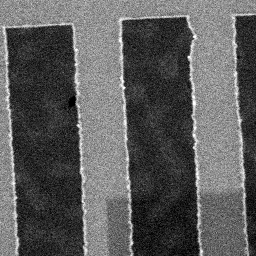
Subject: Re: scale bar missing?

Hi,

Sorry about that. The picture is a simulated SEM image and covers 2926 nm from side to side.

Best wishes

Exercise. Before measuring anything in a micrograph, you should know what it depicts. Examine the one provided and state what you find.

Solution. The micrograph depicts one or a few lines or trenches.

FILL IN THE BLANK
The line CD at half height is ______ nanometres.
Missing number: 789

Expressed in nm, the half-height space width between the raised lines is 519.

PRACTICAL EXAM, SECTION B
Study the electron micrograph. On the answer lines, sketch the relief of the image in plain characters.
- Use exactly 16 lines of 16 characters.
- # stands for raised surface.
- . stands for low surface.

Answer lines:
................
........####...#
#####...####...#
#####...####...#
#####...####...#
#####...####...#
.####...####...#
.####...####...#
.####...####...#
.####...####...#
.####...####...#
.####...####...#
.####...####...#
.####...####...#
.####...####...#
.####...#####..#